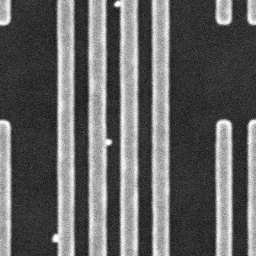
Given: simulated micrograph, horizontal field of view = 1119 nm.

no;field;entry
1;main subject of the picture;wiring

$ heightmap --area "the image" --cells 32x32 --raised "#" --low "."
#......##..##..##..##......##..#
#......##..##..##..##......##..#
#......##..##..##..##......##..#
.......##..##..##..##...........
.......##..##..##..##...........
.......##..##..##..##...........
.......##..##..##..##...........
.......##..##..##..##...........
.......##..##..##..##...........
.......##..##..##..##...........
.......##..##..##..##...........
.......##..##..##..##...........
.......##..##..##..##...........
.......##..##..##..##...........
.......##..##..##..##...........
#......##..##..##..##......##..#
#......##..##..##..##......##..#
#......##..##..##..##......##..#
#......##..##..##..##......##..#
#......##..##..##..##......##..#
#......##..##..##..##......##..#
#......##..##..##..##......##..#
#......##..##..##..##......##..#
#......##..##..##..##......##..#
#......##..##..##..##......##..#
#......##..##..##..##......##..#
#......##..##..##..##......##..#
#......##..##..##..##......##..#
#......##..##..##..##......##..#
#......##..##..##..##......##..#
#......##..##..##..##......##..#
#......##..##..##..##......##..#